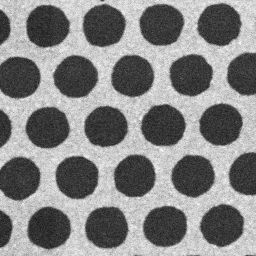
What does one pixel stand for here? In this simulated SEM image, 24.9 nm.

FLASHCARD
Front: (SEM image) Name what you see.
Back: a regular array of holes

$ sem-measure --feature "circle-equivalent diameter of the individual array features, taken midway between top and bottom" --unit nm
1030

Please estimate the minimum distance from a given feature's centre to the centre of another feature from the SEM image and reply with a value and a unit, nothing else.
1430 nm